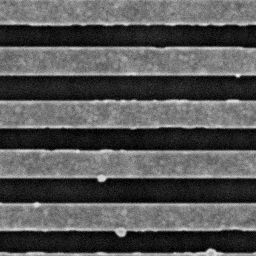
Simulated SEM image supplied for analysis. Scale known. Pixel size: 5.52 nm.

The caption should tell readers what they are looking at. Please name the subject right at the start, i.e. lines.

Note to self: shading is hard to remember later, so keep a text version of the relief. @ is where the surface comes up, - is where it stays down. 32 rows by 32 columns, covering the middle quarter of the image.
@@@@@@@@@@@@@@@@@@@@@@@@@@@@@@@@
@@@@@@@@@@@@@@@@@@@@@@@@@@@@@@@@
@@@@@@@@@@@@@@@@@@@@@@@@@@@@@@@@
--------------------------------
--------------------------------
--------------------------------
--------------------------------
--------------------------------
--------------------------------
@@@@@@@@@@@@@@@@@@@@@@@@@@@@@@@@
@@@@@@@@@@@@@@@@@@@@@@@@@@@@@@@@
@@@@@@@@@@@@@@@@@@@@@@@@@@@@@@@@
@@@@@@@@@@@@@@@@@@@@@@@@@@@@@@@@
@@@@@@@@@@@@@@@@@@@@@@@@@@@@@@@@
@@@@@@@@@@@@@@@@@@@@@@@@@@@@@@@@
@@@@@@@@@@@@@@@@@@@@@@@@@@@@@@@@
--------------------------------
--------------------------------
--------------------------------
--------------------------------
--------------------------------
--------------------------------
@@@@@@@@@@@@@@@@@@@@@@@@@@@@@@@@
@@@@@@@@@@@@@@@@@@@@@@@@@@@@@@@@
@@@@@@@@@@@@@@@@@@@@@@@@@@@@@@@@
@@@@@@@@@@@@@@@@@@@@@@@@@@@@@@@@
@@@@@@@@@@@@@@@@@@@@@@@@@@@@@@@@
@@@@@@@@@@@@@@@@@@@@@@@@@@@@@@@@
--------@@@---------------------
--------------------------------
--------------------------------
--------------------------------